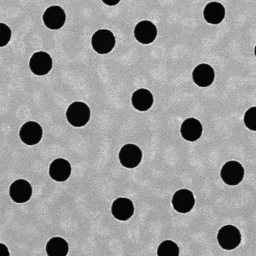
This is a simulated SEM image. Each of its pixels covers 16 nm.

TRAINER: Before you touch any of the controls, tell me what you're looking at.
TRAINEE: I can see a regular array of holes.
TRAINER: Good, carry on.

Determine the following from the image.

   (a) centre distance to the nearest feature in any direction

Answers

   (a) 859 nm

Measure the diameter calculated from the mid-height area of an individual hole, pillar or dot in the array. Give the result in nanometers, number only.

384